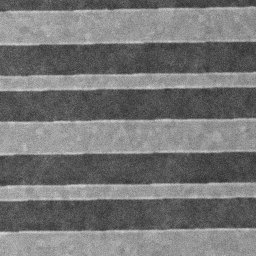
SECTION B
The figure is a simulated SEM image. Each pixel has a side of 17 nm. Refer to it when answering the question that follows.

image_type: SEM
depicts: lines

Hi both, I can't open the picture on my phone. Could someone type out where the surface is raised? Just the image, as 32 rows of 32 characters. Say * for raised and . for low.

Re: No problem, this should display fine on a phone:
................................
.*******************************
********************************
********************************
********************************
***.............................
................................
................................
................................
....****************************
********************************
................................
................................
................................
................................
********************************
********************************
********************************
********************************
................................
................................
................................
................................
********************************
********************************
................................
................................
................................
................................
********************************
********************************
********************************